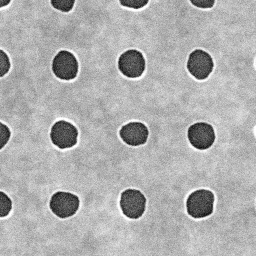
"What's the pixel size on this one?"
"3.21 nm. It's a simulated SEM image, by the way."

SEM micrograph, a regular array of holes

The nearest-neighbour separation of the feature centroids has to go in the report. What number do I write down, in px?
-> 67.8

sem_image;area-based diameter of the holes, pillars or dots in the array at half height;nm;93.1